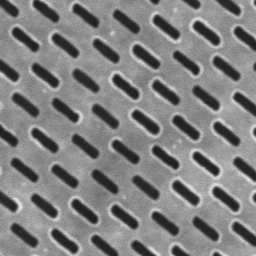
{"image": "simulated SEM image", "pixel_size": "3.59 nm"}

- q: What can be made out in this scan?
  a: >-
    a regular array of holes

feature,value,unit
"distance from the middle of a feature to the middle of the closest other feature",129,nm